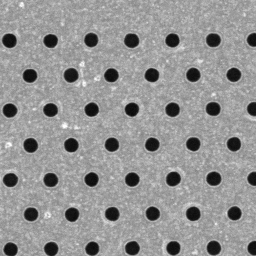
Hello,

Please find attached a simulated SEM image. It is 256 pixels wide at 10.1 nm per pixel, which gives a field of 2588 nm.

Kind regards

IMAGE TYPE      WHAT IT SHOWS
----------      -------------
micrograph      a regular array of holes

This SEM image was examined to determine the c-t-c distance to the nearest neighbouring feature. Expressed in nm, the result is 402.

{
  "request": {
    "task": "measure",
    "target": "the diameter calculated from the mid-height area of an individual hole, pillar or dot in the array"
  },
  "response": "150 nanometers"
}